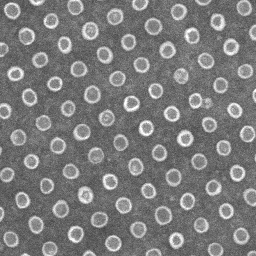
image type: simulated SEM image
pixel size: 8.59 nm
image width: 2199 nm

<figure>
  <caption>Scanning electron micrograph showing a regular array of raised bodies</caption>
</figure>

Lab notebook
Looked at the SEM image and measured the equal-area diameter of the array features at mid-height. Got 125 nm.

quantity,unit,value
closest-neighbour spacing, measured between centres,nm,236